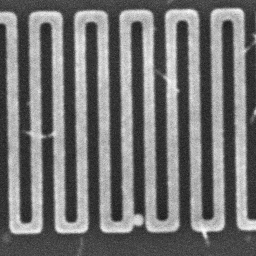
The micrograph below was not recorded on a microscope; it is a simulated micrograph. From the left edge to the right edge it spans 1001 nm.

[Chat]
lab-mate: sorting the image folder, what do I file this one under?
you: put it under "groups of lines, slits or small figures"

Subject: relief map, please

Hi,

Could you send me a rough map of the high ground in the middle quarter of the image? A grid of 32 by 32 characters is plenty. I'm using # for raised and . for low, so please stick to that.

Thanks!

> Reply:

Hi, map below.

...##....##...##....##....##...#
...##....##....#....##....##....
...##....##....#....##....##....
...##....##....#....##....##....
...##....##....#....##....##....
...##....##....##...##....##....
...##....##....##...##....##....
...##....##...###...##....##....
...##....##....##...##....##....
...##....##....##...##....##....
...##....##....##...##....##....
...##....##....##...##....##....
...##....##....##...##....##....
...##....##....##...##....##....
...##....##....##...##....##....
...##....##....##...##....##....
...##....##....##...##....##....
...###...##....##...##....##....
...###...##....##...###...##....
...###...##....##...###...##....
...###...##....##...###...##....
...###...##....##...###...##....
...###...##....##...###...##....
...###...##....##...###...##....
...###...##....##...###...##....
...###...##....##...###...##....
...###...##....##...###...##....
...###...##....##....##...##....
...###...##....##....##...##....
...###...##....##....##...##....
...###...##....##....##...##....
....##...##....##....##...##....